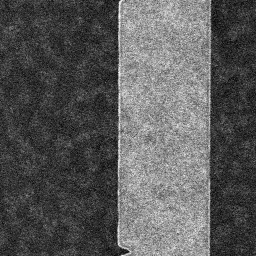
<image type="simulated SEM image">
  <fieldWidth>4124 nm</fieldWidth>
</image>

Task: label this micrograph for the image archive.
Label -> one or a few lines or trenches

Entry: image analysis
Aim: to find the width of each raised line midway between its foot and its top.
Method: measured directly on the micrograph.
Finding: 1.47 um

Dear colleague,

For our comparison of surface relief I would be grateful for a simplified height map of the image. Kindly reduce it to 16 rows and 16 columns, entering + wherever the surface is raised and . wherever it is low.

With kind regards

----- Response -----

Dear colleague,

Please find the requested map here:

........+++++...
.......++++++...
.......++++++...
.......++++++...
.......++++++...
.......++++++...
.......++++++...
.......++++++...
.......++++++...
.......++++++...
.......++++++...
.......++++++...
.......++++++...
.......++++++...
.......++++++...
........+++++...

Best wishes